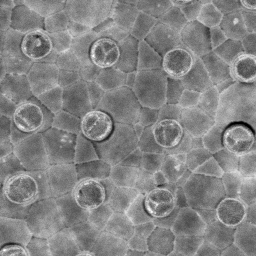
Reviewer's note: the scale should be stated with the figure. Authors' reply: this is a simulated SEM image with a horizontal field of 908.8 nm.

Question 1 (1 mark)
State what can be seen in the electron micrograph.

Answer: a regular array of raised bodies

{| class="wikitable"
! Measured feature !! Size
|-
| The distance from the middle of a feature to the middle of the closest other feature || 141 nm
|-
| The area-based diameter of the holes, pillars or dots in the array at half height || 98.2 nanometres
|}